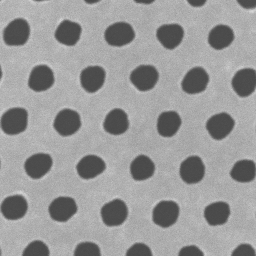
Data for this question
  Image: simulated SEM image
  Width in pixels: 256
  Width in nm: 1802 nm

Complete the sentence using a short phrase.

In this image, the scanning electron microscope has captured a regular array of holes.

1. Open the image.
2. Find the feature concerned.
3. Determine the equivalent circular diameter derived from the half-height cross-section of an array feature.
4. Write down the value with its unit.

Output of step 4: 27.1 pixels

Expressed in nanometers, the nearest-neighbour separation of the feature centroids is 353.